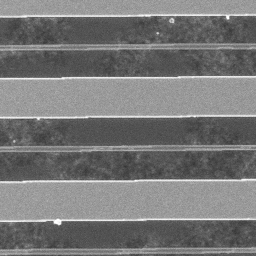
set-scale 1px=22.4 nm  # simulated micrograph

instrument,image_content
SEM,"lines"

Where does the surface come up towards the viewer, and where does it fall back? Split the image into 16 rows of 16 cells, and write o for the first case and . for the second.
oooooooooooooooo
................
................
................
................
oooooooooooooooo
oooooooooooooooo
................
................
................
................
oooooooooooooooo
oooooooooooooooo
oooooooooooooooo
................
................